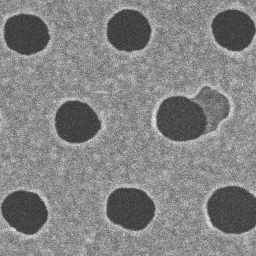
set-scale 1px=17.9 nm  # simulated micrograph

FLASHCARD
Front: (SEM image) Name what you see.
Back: holes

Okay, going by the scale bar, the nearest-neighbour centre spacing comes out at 1830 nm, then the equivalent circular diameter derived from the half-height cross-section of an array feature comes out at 44.6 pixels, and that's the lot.